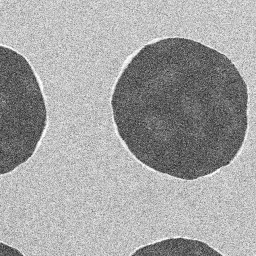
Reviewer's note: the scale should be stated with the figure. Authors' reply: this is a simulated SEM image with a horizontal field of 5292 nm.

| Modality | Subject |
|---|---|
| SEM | holes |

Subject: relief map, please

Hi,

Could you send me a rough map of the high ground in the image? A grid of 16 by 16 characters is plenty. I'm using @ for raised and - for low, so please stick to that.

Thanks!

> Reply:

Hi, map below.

@@@@@@@@@@@@@@@@
@@@@@@@@@@@@@@@@
@@@@@@@@@@--@@@@
-@@@@@@@------@@
--@@@@@@-------@
--@@@@@--------@
---@@@@--------@
---@@@@--------@
---@@@@--------@
--@@@@@@-------@
-@@@@@@@@-----@@
@@@@@@@@@@@@@@@@
@@@@@@@@@@@@@@@@
@@@@@@@@@@@@@@@@
@@@@@@@@@@@@@@@@
-@@@@@@@@----@@@